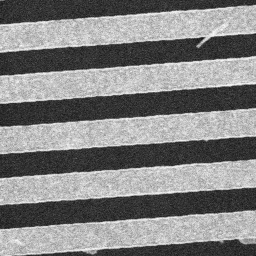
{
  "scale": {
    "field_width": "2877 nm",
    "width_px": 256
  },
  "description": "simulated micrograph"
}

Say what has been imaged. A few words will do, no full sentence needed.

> lines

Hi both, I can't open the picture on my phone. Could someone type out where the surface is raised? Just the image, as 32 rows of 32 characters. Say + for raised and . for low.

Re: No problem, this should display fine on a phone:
................................
.....................+++++++++++
.........+++++++++++++++++++++++
++++++++++++++++++++++++++++++++
+++++++++++++++++++++++++++.....
++++++++++++++..................
................................
...........................+++++
..............++++++++++++++++++
..++++++++++++++++++++++++++++++
++++++++++++++++++++++++++++++..
++++++++++++++++++..............
++++++..........................
................................
...................+++++++++++++
......++++++++++++++++++++++++++
++++++++++++++++++++++++++++++++
++++++++++++++++++++++++........
++++++++++......................
................................
..........................++++++
...........+++++++++++++++++++++
++++++++++++++++++++++++++++++++
++++++++++++++++++++++++++++++..
+++++++++++++++.................
+...............................
..............................++
..................++++++++++++++
...+++++++++++++++++++++++++++++
++++++++++++++++++++++++++++++++
+++++++++++++++++++++...........
+++++++.........................